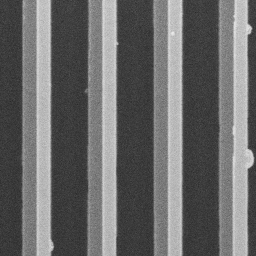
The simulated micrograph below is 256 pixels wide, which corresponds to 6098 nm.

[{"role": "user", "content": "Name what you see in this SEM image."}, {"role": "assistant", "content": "lines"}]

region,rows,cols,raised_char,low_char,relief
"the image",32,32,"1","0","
00011100000111100001111000001110
00011100000111000001111000001110
00011100000111100001111000001110
00011100000111100001111000001110
00011100000111100001111000001110
00011100000111100001111000001110
00011100000111000001111000001110
00011100000111000001111000001110
00011100000111000001111000001110
00011100000111000001111000001110
00011100000111000001111000001110
00011100000111000001111000001110
00011100000111000001111000001110
00011100000111000001111000001110
00011100000111000001111000001110
00011100000111000001111000001110
00011100000111000001111000001110
00011100000111000001111000001110
00011100000111000001111000001110
00011100000111000001111000001111
00011100000111000001111000001111
00011100000111000001111000001110
00011100000111000001111000001110
00011100000111000001111000001110
00011100000111000001111000001110
00011100000111000001111000001110
00011100000111000001111000001110
00011100000111000001111000001110
00011100000111100001111000001110
00011100000111000001111000001110
00011110000111000001111000001110
00011100000111000001111000001110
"